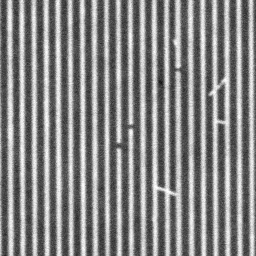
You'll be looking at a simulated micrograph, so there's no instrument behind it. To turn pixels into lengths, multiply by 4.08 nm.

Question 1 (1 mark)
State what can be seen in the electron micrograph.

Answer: parallel lines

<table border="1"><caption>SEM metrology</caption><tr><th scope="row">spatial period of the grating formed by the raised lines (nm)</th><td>49.2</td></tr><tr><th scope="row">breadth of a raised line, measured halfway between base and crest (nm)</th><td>13.8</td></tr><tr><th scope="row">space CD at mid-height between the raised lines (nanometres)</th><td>34.7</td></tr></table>